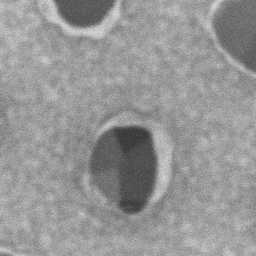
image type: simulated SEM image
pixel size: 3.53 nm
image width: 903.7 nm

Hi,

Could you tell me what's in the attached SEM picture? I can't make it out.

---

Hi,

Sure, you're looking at raised bodies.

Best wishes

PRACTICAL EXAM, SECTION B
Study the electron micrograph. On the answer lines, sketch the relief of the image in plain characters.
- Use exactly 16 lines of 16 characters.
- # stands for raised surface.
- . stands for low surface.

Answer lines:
...####......###
....###......###
.............###
..............##
...............#
................
................
................
......####......
......####......
.....#####......
.....#####......
......####......
........#.......
................
................